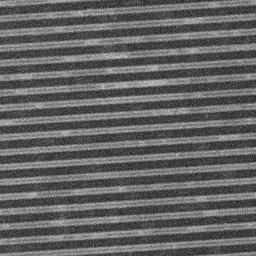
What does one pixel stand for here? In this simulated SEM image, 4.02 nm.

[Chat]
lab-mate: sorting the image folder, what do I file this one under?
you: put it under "parallel lines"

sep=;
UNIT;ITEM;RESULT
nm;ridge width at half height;20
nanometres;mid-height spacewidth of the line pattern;40.1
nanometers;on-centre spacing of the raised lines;59.7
